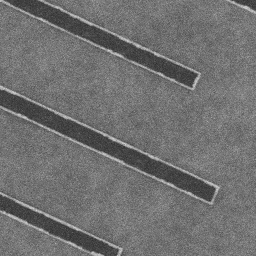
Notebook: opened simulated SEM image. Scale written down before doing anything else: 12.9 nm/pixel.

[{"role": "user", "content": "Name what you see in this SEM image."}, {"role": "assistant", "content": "one or a few lines or trenches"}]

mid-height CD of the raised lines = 0.245 microns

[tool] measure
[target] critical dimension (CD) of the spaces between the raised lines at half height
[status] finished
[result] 980 nm